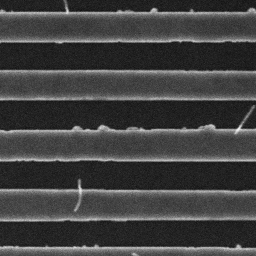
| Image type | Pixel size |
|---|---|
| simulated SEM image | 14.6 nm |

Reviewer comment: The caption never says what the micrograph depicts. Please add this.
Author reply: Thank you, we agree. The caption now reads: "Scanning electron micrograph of lines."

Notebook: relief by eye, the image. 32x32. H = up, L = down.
LLLLLLLLLLLLLLLLLLLLLLLLLLLLLLLL
HLLLLLLLHLLLLLHHHLHHLLLHLLLLLLLH
HHHHHHHHHHHHHHHHHHHHHHHHHHHHHHHH
HHHHHHHHHHHHHHHHHHHHHHHHHHHHHHHH
HHHHHHHHHHHHHHHHHHHHHHHHHHHHHHHH
LLLLLLLLLLLLLLLLLLLLLLLLLLLLLLLL
LLLLLLLLLLLLLLLLLLLLLLLLLLLLLLLL
LLLLLLLLLLLLLLLLLLLLLLLLLLLLLLLL
LLLLLLLLLLLLLLLLLLLLLLLLLLLLLLLL
HHHHHHHHHHHHHHHHHHHHHHHHHHHHHHHH
HHHHHHHHHHHHHHHHHHHHHHHHHHHHHHHH
HHHHHHHHHHHHHHHHHHHHHHHHHHHHHHHH
LLLLLLLLLLLLLLLLLLLLLLLLLLLLLLLL
LLLLLLLLLLLLLLLLLLLLLLLLLLLLLLLL
LLLLLLLLLLLLLLLLLLLLLLLLLLLLLLLL
LLLLLLLLLLLLLLLLLLLLLLLLLLLLLLLL
HHHHHHHHHHHHHHHHHHHHHHHHHHHHHHHH
HHHHHHHHHHHHHHHHHHHHHHHHHHHHHHHH
HHHHHHHHHHHHHHHHHHHHHHHHHHHHHHHH
HHHHHHHHHHHHHHHHHHHHHHHHHHHHHHHH
LLLLLLLLLLLLLLLLLLLLLLLLLLLLLLLL
LLLLLLLLLLLLLLLLLLLLLLLLLLLLLLLL
LLLLLLLLLLLLLLLLLLLLLLLLLLLLLLLL
LLLLLLLLLHLLLLLLLLLLLLLLLLLLLLLL
HHHHHHHHHHHHHHHHHHHHHHHHHHHHHHHH
HHHHHHHHHHHHHHHHHHHHHHHHHHHHHHHH
HHHHHHHHHHHHHHHHHHHHHHHHHHHHHHHH
HHHHHHHHLHHLLLHHLLLLLLLLLLLLLLLL
LLLLLLLLLLLLLLLLLLLLLLLLLLLLLLLL
LLLLLLLLLLLLLLLLLLLLLLLLLLLLLLLL
LLLLLLLLLLLLLLLLLLLLLLLLLLLLLLLL
HHHHHHHHHHHHHHHHHHHHHHHHHHHHHHHH